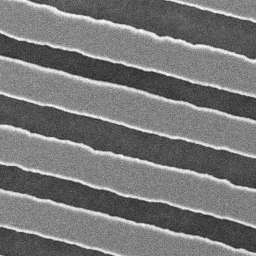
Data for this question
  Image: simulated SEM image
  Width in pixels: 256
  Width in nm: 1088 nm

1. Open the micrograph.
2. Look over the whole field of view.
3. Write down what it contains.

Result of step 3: lines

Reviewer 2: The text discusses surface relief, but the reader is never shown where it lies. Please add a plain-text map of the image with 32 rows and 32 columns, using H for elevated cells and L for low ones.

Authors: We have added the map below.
HHHHHLLLLLLLLLLLLLLLLLLHHHHHHHHH
HHHHHHHHLLLLLLLLLLLLLLLLLLLHHHHH
HHHHHHHHHHHHLLLLLLLLLLLLLLLLLLLH
HHHHHHHHHHHHHHHHHLLLLLLLLLLLLLLL
LHHHHHHHHHHHHHHHHHHHLLLLLLLLLLLL
LLLLHHHHHHHHHHHHHHHHHHHHLLLLLLLL
LLLLLLLLLLHHHHHHHHHHHHHHHHHHHLLL
HHLLLLLLLLLLLHHHHHHHHHHHHHHHHHHH
HHHHHHLLLLLLLLLLLHHHHHHHHHHHHHHH
HHHHHHHHHHLLLLLLLLLLLHHHHHHHHHHH
HHHHHHHHHHHHHHLLLLLLLLLLLHHHHHHH
HHHHHHHHHHHHHHHHHHLLLLLLLLLLLHHH
LLLHHHHHHHHHHHHHHHHHHLLLLLLLLLLL
LLLLLLLHHHHHHHHHHHHHHHHHHLLLLLLL
LLLLLLLLLLLHHHHHHHHHHHHHHHHHHLLL
LLLLLLLLLLLLLLLHHHHHHHHHHHHHHHHH
HHHHLLLLLLLLLLLLLLHHHHHHHHHHHHHH
HHHHHHHHLLLLLLLLLLLLLLLHHHHHHHHH
HHHHHHHHHHHLLLLLLLLLLLLLLLHHHHHH
HHHHHHHHHHHHHHHHLLLLLLLLLLLLLLLH
HHHHHHHHHHHHHHHHHHHLLLLLLLLLLLLL
LLLLHHHHHHHHHHHHHHHHHHHHLLLLLLLL
LLLLLLLLLHHHHHHHHHHHHHHHHHHHLLLL
LLLLLLLLLLLLHHHHHHHHHHHHHHHHHHHL
HHHHLLLLLLLLLLLHHHHHHHHHHHHHHHHH
HHHHHHHHLLLLLLLLLLLLLHHHHHHHHHHH
HHHHHHHHHHHHLLLLLLLLLLLLHHHHHHHH
HHHHHHHHHHHHHHHHLLLLLLLLLLLLLHHH
LHHHHHHHHHHHHHHHHHHHLLLLLLLLLLLL
LLLLLHHHHHHHHHHHHHHHHHHHLLLLLLLL
LLLLLLLLLHHHHHHHHHHHHHHHHHHHLLLL
LLLLLLLLLLLLLHHHHHHHHHHHHHHHHHHL